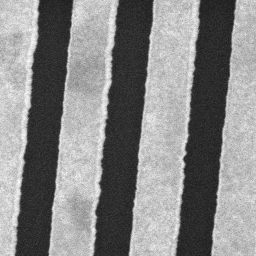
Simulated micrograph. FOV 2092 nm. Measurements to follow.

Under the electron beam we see lines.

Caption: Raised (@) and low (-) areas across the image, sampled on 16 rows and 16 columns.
@@---@@---@@---@
@@--@@@---@@---@
@@--@@@--@@@---@
@@--@@@--@@@--@@
@@--@@@--@@@--@@
@@--@@@--@@@--@@
@@--@@@--@@@--@@
@@--@@@--@@@--@@
@@--@@---@@@--@@
@---@@---@@@--@@
@---@@---@@---@@
@---@@---@@---@@
@--@@@--@@@---@@
@--@@@--@@@--@@@
@--@@@--@@@--@@@
@--@@@--@@@--@@@